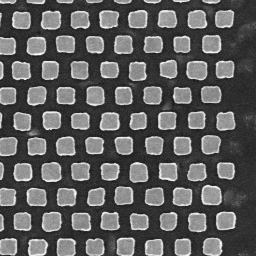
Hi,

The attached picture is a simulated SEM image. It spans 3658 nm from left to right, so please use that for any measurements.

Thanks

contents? a regular array of raised bodies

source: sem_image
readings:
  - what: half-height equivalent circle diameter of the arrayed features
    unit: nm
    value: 269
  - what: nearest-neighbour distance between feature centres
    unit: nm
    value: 400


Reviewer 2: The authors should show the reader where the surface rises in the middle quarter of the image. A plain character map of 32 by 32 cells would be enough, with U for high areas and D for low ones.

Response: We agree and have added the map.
DDUUUUDDDUUUUDDDDUUUDDDDUUUUDDDU
DDUUUUDDDUUUUDDDDUUUDDDDUUUUDDDU
DDUUUUDDDUUUUDDDUUUUDDDDUUUUDDDU
DDUUUUDDDDDDDDDDUUUUDDDDDDDDDDDD
DDDDDDDDDDDDDDDDDDDDDDDDDDDDDDDD
DDDDDDDDDDDDDDDDDDDDDDDDDDDDDDDD
UUDDDDUUUUDDDUUUUDDDUUUUDDDDUUUD
UUUDDDUUUUDDDUUUUDDDUUUUDDDDUUUU
UUDDDDUUUUDDDUUUUDDDUUUUDDDUUUUU
UUDDDDUUUUDDDUUUUDDDUUUUDDDDUUUD
DDDDDDDDDDDDDDDDDDDDDDDDDUDDDDDD
DDDDDDDDDDDDDDDDDDDDDDDDDDDDDDDD
DDDDUUDDDDUUUDDDDUUUDDDDUUUUDDDU
DDUUUUDDDDUUUDDDDUUUDDDDUUUUDDDU
DDUUUUDDDUUUUUDDDUUUDDDDUUUUDDDU
DDUUUUDDDUUUUUDDUUUUDDDDUUUUDDDU
DDDDDDDDDDUDUDDDDDDDDDDDDDDDDDDD
DDDDDDDDDDDDDDDDDDDDDDDDDDDDDDDD
UUDDDDUUDDDDDDDDDDDDDUUUDDDDUUUD
UUUDDUUUUUDDDUUUUDDDDUUUUDDDUUUD
UUUDDUUUUUDDDUUUUDDDDUUUUDDDUUUD
UUUDDDUUUUDDDUUUUDDDDUUUUDDDUUUU
UUDDDDDDDDDDDDUUDDDDDDUUDDDDUUDD
DDDDDDDDDDDDDDDDDDDDDDDDDDDDDDDD
DDDDDDDDDDDDDDDDDDDDDDDDDDDDDDDD
DDUUUUDDDDUUUDDDDUUUUDDDUUUUDDDD
DDUUUUDDDDUUUUDDDUUUUDDDUUUUDDDU
DDUUUUDDDDUUUDDDDUUUUDDDUUUUDDDU
DDUUUUDDDDUUUDDDDUUUUDDDUUUUDDDU
DDDDDDDDDDDDDDDDDUUDDDDDDDDDDDDD
DDDDDDDDDDDDDDDDDDDDDDDDDDDDDDDD
UUUDDDDUUUDDDUUUUDDDDUUUUDDDUUUU